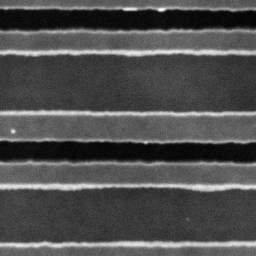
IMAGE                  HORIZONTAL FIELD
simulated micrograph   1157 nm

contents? lines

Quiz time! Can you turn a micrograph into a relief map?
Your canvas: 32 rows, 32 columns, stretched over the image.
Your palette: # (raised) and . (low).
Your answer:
################################
................................
................................
................................
################################
################################
######################.#########
................................
................................
................................
................................
................................
................................
................................
################################
################################
################################
################################
................................
................................
##############################.#
################################
################################
........#...............####..#.
................................
................................
................................
................................
................................
................................
................................
################################